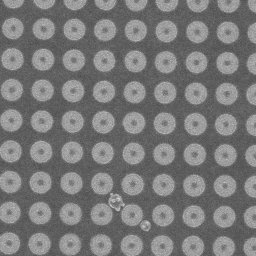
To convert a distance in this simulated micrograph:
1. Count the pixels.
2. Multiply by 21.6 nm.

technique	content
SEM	an array of small figures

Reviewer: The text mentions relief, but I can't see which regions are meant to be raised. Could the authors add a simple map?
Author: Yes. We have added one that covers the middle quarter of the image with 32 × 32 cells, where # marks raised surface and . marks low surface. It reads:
.....###....####....###.....###.
##.######..#####...#####...####.
################################
################################
#...#####..######.##############
.....###....####....###....####.
.....##......##.....###.....###.
.....###....###.....###.....##..
....####....####....###.....###.
#################.######...#####
################################
################################
#...####...#####...#####..######
.....###....###.....###....####.
.....##.....###.....###.....##..
....###.....###.....###.....##..
#...####...#####...####....####.
################################
################################
################################
....####....####...#####...####.
....###.....###.....###....###..
....###.....###.....##......##..
....###.....###.....###....###..
#..######..#####...####...#####.
################################
################################
#..######.######################
....###.....###....####....####.
....###.....###.....###....###..
....###.....###.....##.....###..
....####....###....####....###..